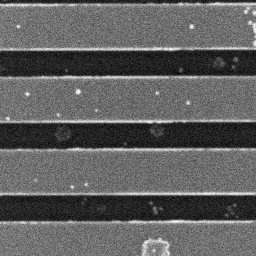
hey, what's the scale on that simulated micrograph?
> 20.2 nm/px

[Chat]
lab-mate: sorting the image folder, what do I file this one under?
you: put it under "lines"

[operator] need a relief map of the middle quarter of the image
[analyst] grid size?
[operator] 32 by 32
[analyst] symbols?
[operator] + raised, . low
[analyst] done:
................................
................................
................................
++++++++++++++++++++++++++++++++
++++++++++++++++++++++++++++++++
++++++++++++++++++++++++++++++++
++++++++++++++++++++++++++++++++
++++++++++++++++++++++++++++++++
++++++++++++++++++++++++++++++++
++++++++++++++++++++++++++++++++
++++++++++++++++++++++++++++++++
++++++++++++++++++++++++++++++++
++++++++++++++++++++++++++++++++
++++++++++++++++++++++++++++++++
................................
................................
................................
................................
................................
................................
................................
.++++.+.++++++++++++++++++++++++
++++++++++++++++++++++++++++++++
++++++++++++++++++++++++++++++++
++++++++++++++++++++++++++++++++
++++++++++++++++++++++++++++++++
++++++++++++++++++++++++++++++++
++++++++++++++++++++++++++++++++
++++++++++++++++++++++++++++++++
++++++++++++++++++++++++++++++++
++++++++++++++++++++++++++++++++
++++++++++++++++++++++++++++++++